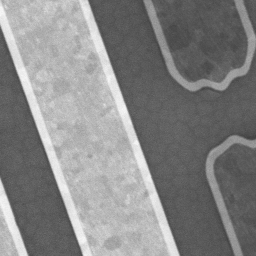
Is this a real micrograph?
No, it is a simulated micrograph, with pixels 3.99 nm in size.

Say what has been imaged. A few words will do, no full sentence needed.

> one or a few lines or trenches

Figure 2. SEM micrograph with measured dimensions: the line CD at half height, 329 nanometers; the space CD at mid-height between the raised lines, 0.241 micrometres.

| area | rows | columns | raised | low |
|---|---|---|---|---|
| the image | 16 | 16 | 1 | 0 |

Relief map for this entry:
1111100001111110
1111110000111110
0111110000111111
0111110000111111
0111111000011110
0011111000000000
0011111100000000
0011111100000000
0001111100000000
0001111110000011
0000111110000111
0000111110000111
0000111111000011
1000011111000011
1000011111000011
1000011111100001